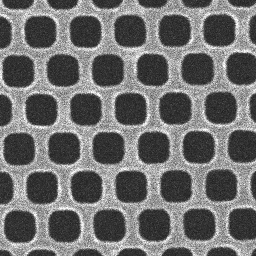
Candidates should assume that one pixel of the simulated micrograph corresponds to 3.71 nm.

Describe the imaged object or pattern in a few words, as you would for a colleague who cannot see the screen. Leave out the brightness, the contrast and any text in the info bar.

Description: a regular array of holes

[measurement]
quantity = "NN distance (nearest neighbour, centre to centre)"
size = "0.165 um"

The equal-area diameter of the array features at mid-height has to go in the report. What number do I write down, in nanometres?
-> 128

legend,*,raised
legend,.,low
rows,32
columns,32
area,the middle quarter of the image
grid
....***........***........***...
....***........***........***...
....***........***........***...
....***........***........***...
....***........****.......****..
..*******....*******....********
********************************
***....*******.....******......*
**.......****.......****.......*
**.......****........***........
*.........***........***........
*.........***........***........
**........***........***........
**.......****........***........
**.......****.......*****......*
****...*********..**************
********************************
...*****......*****......******.
....***........****.......****..
....***........***.........***..
....***........***.........***..
....***........***.........***..
....***........***.........***..
....***........****.......****..
...*****......******.....******.
********************************
***************..**********.****
***......****.......*****......*
**.......****........***........
**........***........***........
**........***........***........
**........***........***........